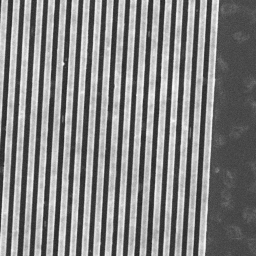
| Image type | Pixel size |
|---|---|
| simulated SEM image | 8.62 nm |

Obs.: parallel lines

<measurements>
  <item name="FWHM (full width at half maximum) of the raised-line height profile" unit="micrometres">0.0517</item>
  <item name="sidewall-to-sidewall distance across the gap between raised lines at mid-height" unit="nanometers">43.1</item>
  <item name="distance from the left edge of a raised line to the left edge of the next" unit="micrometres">0.101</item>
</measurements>